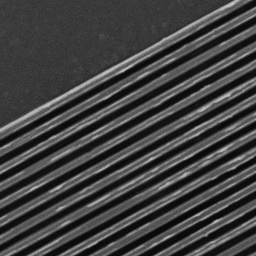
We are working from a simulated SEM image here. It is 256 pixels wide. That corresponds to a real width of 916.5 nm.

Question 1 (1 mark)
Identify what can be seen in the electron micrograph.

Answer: parallel lines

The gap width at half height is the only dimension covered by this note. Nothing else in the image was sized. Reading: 27 nanometres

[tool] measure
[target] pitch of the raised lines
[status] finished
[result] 54.8 nm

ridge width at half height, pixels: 8.3